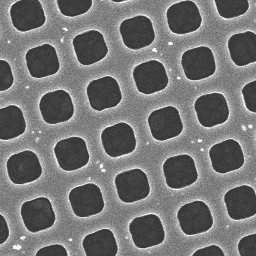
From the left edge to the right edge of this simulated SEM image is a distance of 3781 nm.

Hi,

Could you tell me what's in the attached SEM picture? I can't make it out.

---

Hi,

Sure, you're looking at a regular array of holes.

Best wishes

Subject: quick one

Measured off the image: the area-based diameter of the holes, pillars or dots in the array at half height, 508 nm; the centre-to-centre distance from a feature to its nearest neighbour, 711 nm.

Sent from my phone